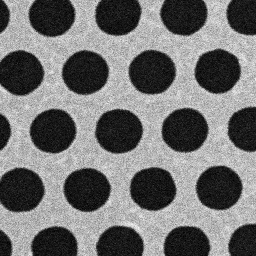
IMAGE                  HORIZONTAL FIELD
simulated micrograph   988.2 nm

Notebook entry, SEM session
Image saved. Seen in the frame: a regular array of holes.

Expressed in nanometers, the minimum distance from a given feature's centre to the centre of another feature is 255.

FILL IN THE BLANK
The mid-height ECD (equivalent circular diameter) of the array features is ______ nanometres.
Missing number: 177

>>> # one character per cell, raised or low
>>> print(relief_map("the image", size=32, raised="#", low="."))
.###.....###.....###......###...
.###.....###......##......##....
.###.....###......##......##....
.###.....###.....####....####...
######.#######.#################
################################
#...######..######..######...###
.....###.....####.....###.....##
.....###......##......##......##
......##......##......##......##
.....###.....####....####.....##
#...#####...#####....#####..####
################################
#######################.#######.
#####....####....####....####...
.###.....###......##......###...
.###......##......##......##....
.###.....###......##......###...
#####...#####....####....#####..
################################
################################
#...#####....####....####....###
.....###......##......###.....##
......##......##......##......##
.....###......##......###.....##
.....####....####....####....###
##.#############################
################################
######..######..######...#####..
.###.....###......###.....###...
.###......##......##......###...
.###......##......##......###...